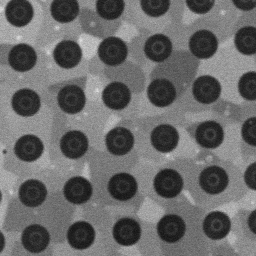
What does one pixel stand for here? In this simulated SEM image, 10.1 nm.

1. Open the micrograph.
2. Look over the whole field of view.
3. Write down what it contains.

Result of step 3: an array of small figures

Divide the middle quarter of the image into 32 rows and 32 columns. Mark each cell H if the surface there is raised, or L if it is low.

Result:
LLLHHHHHHHHLLHHHHHHHHHHHHHHHHHHH
HHHHHHHHHHHHHHHHHHHHHHHHHHHHHHHH
HHHHHHHHHHHHHHHHHHHHHHHHHHHHHHHH
HHHHHHHHHHHHHHHHHHHHHHHLLHHHHHHH
HHHHHHHHHHHHLLHHHHHHHHLLLLLHHHHH
LLLLHHHHHHLLLLLLHHHHHLLLLLLLHHHH
LLLLLHHHHHLLLLLLHHHHHLLHHHLLHHHH
LHLLLHHHHLLLHHLLLHHHHLLHHHLLHHHH
HHHLLLHHHLLLHHLLLHHHHLLHHLLLHHHH
LHHLLLHHHHLLLLLLHHHHHLLLLLLHHHHH
LLLLLHHHHHLLLLLLHHHHHHHLLLHHHHHH
LLLLLHHHHHHHLLHHHHHHHHHHHHHHHHHH
HLLHHHHHHHHHHHHHHHHHHHHHHHHHHHHH
HHHHHHHHHHHHHHHHHHHHHHHHHHHHHHHH
HHHHHHHHHHHHHHHHHHHHHHHHHHHHHHHH
HHHHHHHHHHHHHHHHHHHHHHHLLLLHHHHH
HHLHHHHHHHHHLLLLHHHHHHLLLLLLHHHH
LLLLLHHHHHHLLLLLLHHHHHLLHHLLLHHH
LLLLLLHHHHLLLHHLLLHHHLLLHHHLLHHH
LHHHLLHHHHLLLHHLLLHHHHLLHHLLLHHH
LHHHLLHHHHLLLHHLLHHHHHLLLLLLHHHH
LLHLLLHHHHHLLLLLLHHHHHHLLLLHHHHH
LLLLLHHHHHHHLLLLHHHHHHHHHHHHHHHH
HLLLHHHHHHHHHHHHHHHHHHHHHHHHHHHH
HHHHHHHHHHHHHHHHHHHHHHHHHHHHHHHH
HHHHHHHHHHHHHHHHHHHHHHHHHHHHHHHH
HHHHHHHHHHHHHHHHHHHHHHHHLLLLHHHH
HHHHHHHHHHHHHLLLLHHHHHHLLLLLLHHH
HHLLLHHHHHHLLLLLLLHHHHLLLLLLLLHH
HLLLLLHHHHHLLLHHLLHHHHLLLHHLLLHH
LLHHLLLHHHHLLHHHLLHHHHLLLHHLLLHH
LLHHHLLHHHHLLLHHLLHHHHHLLLLLLLHH